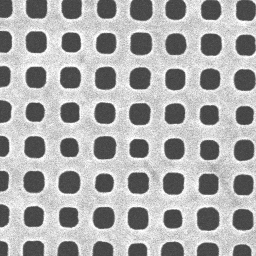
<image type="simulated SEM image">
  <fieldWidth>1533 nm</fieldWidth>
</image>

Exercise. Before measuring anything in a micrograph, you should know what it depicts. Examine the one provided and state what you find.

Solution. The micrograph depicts a regular array of holes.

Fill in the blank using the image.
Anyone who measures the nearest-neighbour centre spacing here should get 207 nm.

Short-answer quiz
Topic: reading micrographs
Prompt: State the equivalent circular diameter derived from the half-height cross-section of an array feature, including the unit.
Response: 132 nanometers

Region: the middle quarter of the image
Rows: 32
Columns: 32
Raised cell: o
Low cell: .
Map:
oooooooooooooooooooooooooooooooo
....oooo.....oooo....ooooo...ooo
....oooo.....oooo.....ooo.....oo
....oooo.....ooo......ooo......o
....oooo.....ooo......ooo.....oo
....oooo.....oooo....oooo.....oo
oooooooooo.oooooooo.ooooooo..ooo
oooooooooooooooooooooooooooooooo
oooooooooooooooooooooooooooooooo
o.oooooooooooooooooooooooooooooo
....oooo.....oooo....ooooo....oo
....oooo.....ooo......ooo.....oo
....oooo.....ooo......ooo.....oo
....oooo.....ooo......ooo.....oo
...ooooo....ooooo....ooooo....oo
oooooooooooooooooooooooooooooooo
oooooooooooooooooooooooooooooooo
oooooooooooooooooooooooooooooooo
oooooooo....ooooooooooooooo..ooo
...ooooo.....oooo....oooo.....oo
....oooo.....ooo.....oooo.....oo
....ooo......ooo.....oooo.....oo
...ooooo.....ooo.....oooo.....oo
oooooooo....oooooo..oooooo...ooo
oooooooooooooooooooooooooooooooo
oooooooooooooooooooooooooooooooo
oooooooooooooooooooooooooooooooo
...oooooo..ooooo....oooooo...ooo
....oooo....oooo.....oooo.....oo
....oooo....oooo.....oooo.....oo
....oooo....oooo.....oooo.....oo
....oooo....oooo.....oooo.....oo